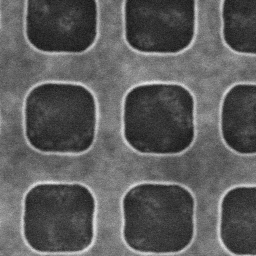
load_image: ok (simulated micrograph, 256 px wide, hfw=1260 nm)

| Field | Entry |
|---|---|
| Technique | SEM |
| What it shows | holes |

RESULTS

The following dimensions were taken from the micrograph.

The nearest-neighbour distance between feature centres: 488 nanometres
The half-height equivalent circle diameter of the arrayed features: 0.37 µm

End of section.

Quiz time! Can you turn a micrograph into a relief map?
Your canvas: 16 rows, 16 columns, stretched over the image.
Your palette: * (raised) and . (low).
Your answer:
**....**....**..
**....**....**..
**....**....**..
****************
****************
**...***...****.
**....**....**..
**....**....**..
**....**....**..
***..****..****.
****************
***.*****.******
**....**....**..
*.....**....**..
*.....**....**..
**...***...***..